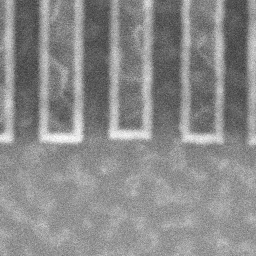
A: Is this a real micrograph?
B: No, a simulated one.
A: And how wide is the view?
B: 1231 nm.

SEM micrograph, one or a few lines or trenches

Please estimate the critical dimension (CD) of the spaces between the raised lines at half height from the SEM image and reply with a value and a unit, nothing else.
161 nm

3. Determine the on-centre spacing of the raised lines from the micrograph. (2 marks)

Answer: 70.6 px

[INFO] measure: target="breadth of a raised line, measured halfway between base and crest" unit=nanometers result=171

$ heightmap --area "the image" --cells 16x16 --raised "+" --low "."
+..++..++...++..
+..++..++...++..
+..++..++...++..
+..++..++...++..
+..++..++...++..
+..++..++...++..
+..++..++...++..
+..++..++...++..
...++.......++..
................
................
................
................
................
................
................